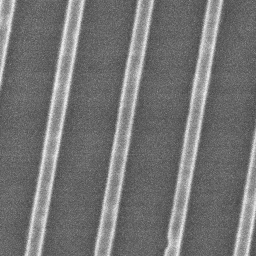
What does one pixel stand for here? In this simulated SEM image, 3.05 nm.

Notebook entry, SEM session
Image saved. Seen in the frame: one or a few lines or trenches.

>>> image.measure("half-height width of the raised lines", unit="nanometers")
39.8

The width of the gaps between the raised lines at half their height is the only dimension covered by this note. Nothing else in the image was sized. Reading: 0.17 micrometres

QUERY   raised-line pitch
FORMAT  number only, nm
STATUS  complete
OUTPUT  208